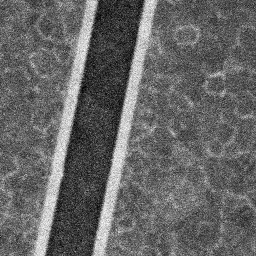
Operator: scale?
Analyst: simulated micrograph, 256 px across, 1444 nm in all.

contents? one or a few lines or trenches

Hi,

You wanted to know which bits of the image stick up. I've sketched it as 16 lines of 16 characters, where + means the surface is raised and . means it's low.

++++++...+++++++
+++++....+++++++
+++++....+++++++
+++++....+++++++
+++++....+++++++
+++++...++++++++
++++....++++++++
++++....++++++++
++++....++++++++
++++....++++++++
++++...+++++++++
+++....+++++++++
+++....+++++++++
+++....+++++++++
+++...++++++++++
+++...++++++++++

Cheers